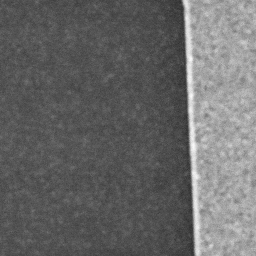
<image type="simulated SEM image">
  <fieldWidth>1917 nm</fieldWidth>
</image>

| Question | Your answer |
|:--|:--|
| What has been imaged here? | one or a few lines or trenches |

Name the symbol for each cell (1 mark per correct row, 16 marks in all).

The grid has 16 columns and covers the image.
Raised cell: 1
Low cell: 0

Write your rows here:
0000000000001111
0000000000001111
0000000000001111
0000000000001111
0000000000001111
0000000000001111
0000000000001111
0000000000001111
0000000000001111
0000000000001111
0000000000001111
0000000000001111
0000000000001111
0000000000001111
0000000000001111
0000000000001111